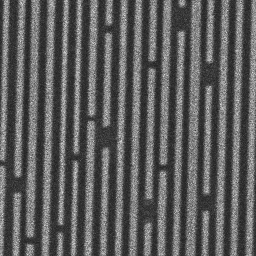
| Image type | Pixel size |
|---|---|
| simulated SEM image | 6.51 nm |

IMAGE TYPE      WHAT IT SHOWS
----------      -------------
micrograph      parallel lines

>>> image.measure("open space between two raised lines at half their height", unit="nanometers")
48.8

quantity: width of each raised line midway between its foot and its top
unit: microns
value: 0.0488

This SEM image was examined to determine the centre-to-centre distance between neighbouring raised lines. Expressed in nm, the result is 94.9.